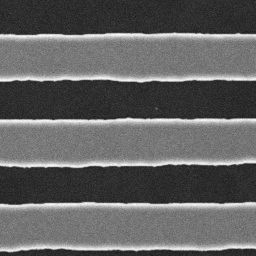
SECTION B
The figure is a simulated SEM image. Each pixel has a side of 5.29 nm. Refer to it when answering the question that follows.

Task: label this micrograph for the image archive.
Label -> lines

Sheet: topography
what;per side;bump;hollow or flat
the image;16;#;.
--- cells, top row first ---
................
................
################
################
################
................
................
.......#########
################
################
................
................
................
################
################
###############.